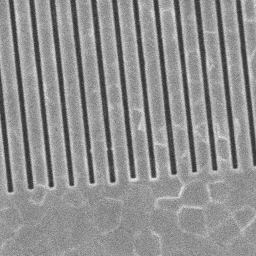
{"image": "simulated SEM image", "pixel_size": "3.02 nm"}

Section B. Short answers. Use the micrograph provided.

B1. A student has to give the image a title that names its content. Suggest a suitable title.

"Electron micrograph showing parallel lines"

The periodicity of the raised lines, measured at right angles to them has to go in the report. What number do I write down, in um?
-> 0.0621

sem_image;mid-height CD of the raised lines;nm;45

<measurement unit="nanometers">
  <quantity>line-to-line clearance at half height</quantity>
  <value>15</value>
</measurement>